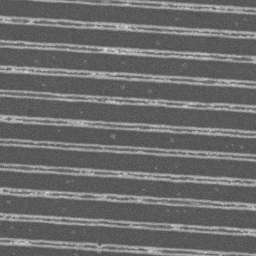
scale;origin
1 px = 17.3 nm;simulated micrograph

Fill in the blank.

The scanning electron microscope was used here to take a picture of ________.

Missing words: parallel lines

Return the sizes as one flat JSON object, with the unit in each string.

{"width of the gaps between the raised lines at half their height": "329 nm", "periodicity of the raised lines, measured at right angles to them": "0.424 um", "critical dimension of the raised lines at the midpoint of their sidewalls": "94.7 nanometers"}